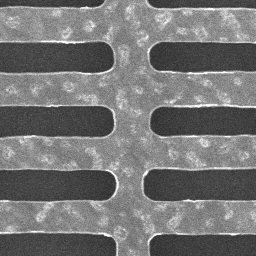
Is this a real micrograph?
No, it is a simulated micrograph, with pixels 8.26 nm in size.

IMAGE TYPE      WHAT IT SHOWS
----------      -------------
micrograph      holes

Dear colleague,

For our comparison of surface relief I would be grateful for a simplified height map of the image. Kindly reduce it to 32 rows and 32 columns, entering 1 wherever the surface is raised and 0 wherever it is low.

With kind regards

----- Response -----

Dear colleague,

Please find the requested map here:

00000000000001111110000000000000
11111111111111111111111111111111
11111111111111111111111111111111
11111111111111111111111111111111
11111111111111111111111111111111
00000000000001111111000000000000
00000000000000111110000000000000
00000000000000111110000000000000
00000000000000111110000000000000
11111111111111111111111111111111
11111111111111111111111111111111
11111111111111111111111111111111
11111111111111111111111111111111
00000000000001111111000000000000
00000000000000111110000000000000
00000000000000111110000000000000
00000000000000111110000000000000
11111111111111111111111111111111
11111111111111111111111111111111
11111111111111111111111111111111
11111111111111111111111111111111
00000000000000111110000000000000
00000000000000111100000000000000
00000000000000011100000000000000
00000000000000111100000000000000
11111111111111111111111111111111
11111111111111111111111111111111
11111111111111111111111111111111
11111111111111111111111111111111
00000000000001111110000000000000
00000000000000011110000000000000
00000000000000011110000000000000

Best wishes